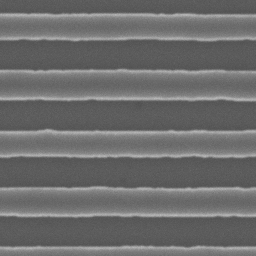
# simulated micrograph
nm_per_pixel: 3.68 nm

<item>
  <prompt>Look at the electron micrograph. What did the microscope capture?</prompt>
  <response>lines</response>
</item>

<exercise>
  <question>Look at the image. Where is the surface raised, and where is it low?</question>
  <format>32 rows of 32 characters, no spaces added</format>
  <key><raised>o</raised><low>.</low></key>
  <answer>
................................
................................
oooooooooooooooooooooooooooooooo
oooooooooooooooooooooooooooooooo
oooooooooooooooooooooooooooooooo
................................
................................
................................
................................
oooooooooooooooooooooooooooooooo
oooooooooooooooooooooooooooooooo
oooooooooooooooooooooooooooooooo
.............................ooo
................................
................................
................................
oooooooooooooooooooooooooooooooo
oooooooooooooooooooooooooooooooo
oooooooooooooooooooooooooooooooo
oooooooooooooooooooooooooooooooo
................................
................................
................................
...........ooo...............o..
oooooooooooooooooooooooooooooooo
oooooooooooooooooooooooooooooooo
oooooooooooooooooooooooooooooooo
................................
................................
................................
................................
oooooooooooooooooooooooooooooooo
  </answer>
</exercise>